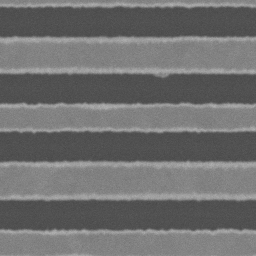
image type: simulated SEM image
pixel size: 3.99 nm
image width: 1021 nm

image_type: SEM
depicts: lines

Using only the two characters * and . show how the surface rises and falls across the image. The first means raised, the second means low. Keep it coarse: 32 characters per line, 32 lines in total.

********************************
................................
................................
................................
................................
********************************
********************************
********************************
********************************
................................
................................
................................
................................
********************************
********************************
********************************
....*..............*............
................................
................................
................................
********************************
********************************
********************************
********************************
********************************
................................
................................
................................
................................
********************************
********************************
********************************